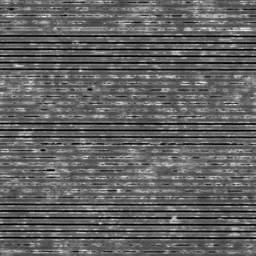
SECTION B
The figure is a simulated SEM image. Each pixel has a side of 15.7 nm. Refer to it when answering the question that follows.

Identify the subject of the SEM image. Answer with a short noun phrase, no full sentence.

parallel lines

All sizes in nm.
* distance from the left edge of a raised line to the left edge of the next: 106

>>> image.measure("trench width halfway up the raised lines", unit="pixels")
1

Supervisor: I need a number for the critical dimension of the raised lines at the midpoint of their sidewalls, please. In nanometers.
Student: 88.1